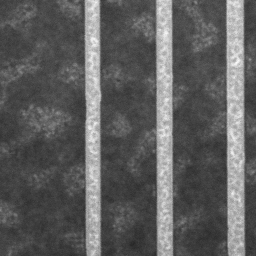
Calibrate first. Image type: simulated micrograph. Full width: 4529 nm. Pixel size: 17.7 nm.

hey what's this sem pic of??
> one or a few lines or trenches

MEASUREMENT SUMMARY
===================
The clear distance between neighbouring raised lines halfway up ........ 1010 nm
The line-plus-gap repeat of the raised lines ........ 1260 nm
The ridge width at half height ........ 0.254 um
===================